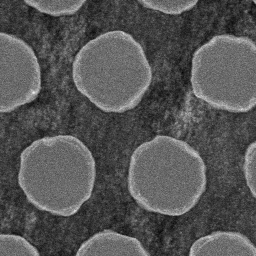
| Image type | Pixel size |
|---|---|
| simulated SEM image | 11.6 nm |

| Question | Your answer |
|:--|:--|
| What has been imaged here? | raised bodies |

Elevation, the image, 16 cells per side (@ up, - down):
--@@@-----@@----
----------------
@-----@@-----@@-
@@---@@@@---@@@@
@@---@@@@---@@@@
@@---@@@@---@@@@
@-----@@-----@@@
----------------
----------------
--@@@@--@@@@---@
-@@@@@--@@@@@--@
-@@@@@--@@@@@--@
--@@@----@@@----
----------------
----------------
@@---@@@@---@@@@